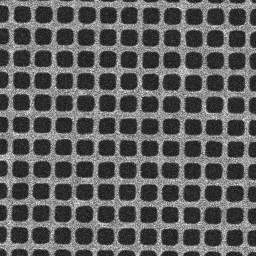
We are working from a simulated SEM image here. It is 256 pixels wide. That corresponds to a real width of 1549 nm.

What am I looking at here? a regular array of holes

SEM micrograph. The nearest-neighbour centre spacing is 129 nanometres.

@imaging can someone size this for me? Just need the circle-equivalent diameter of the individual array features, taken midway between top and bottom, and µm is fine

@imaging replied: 0.112